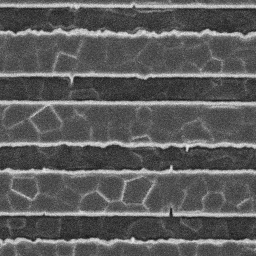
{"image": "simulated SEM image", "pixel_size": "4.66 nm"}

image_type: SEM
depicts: one or a few lines or trenches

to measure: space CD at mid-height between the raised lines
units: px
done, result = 26.5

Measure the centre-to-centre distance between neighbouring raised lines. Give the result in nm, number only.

323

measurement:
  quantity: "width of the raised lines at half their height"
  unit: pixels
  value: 42.8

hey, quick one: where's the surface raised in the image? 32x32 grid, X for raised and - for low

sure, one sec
XXXXXXXXXXXXXXXXXXXXXXXXXXXXXXXX
--------------------------------
--------------------------------
--------------------------------
XXXXXXXXXXXXXXXXXXXXXXXXXXXXXX-X
XXXXXXXXXXXXXXXXXXXXXXXXXXXXXXXX
XXXXXXXXXXXXXXXXXXXXXXXXXXXXXXXX
XXXXXXXXXXXXXXXXXXXXXXXXXXXXXXXX
XXXXXXXXXXXXXXXXXXXXXXXXXXXXXXXX
--------X--------XX-----XX---X-X
--------------------------------
--------------------------------
--------------------------------
XXXXXXXXXXXXXXXXXXXXXXXXXXXXXXXX
XXXXXXXXXXXXXXXXXXXXXXXXXXXXXXXX
XXXXXXXXXXXXXXXXXXXXXXXXXXXXXXXX
XXXXXXXXXXXXXXXXXXXXXXXXXXXXXXXX
XXXXXXXXXXXXXXXXXXXXXXXXXXXXXXXX
--------------------------------
--------------------------------
--------------------------------
XXXXXXX---XXXXXXXXXXXXXXXXXXXXXX
XXXXXXXXXXXXXXXXXXXXXXXXXXXXXXXX
XXXXXXXXXXXXXXXXXXXXXXXXXXXXXXXX
XXXXXXXXXXXXXXXXXXXXXXXXXXXXXXXX
XXXXXXXXXXXXXXXXXXXXXXXXXXXXXXXX
XXXXXXXXXXXXXXXXXXXXXXXXXXXXXXXX
--------------------------------
--------------------------------
--------------------------------
XXXXXXXXXXXXXXXXXXXXXXXXXXXXXXXX
XXXXXXXXXXXXXXXXXXXXXXXXXXXXXXXX